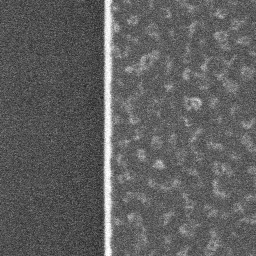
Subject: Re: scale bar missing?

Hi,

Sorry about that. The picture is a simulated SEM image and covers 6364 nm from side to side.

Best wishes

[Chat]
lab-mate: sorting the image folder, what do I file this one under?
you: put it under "one or a few lines or trenches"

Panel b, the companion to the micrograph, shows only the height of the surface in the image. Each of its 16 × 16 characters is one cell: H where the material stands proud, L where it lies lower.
LLLLLLLHHHHHHHHH
LLLLLLLHHHHHHHHH
LLLLLLLHHHHHHHHH
LLLLLLLHHHHHHHHH
LLLLLLLHHHHHHHHH
LLLLLLLHHHHHHHHH
LLLLLLLHHHHHHHHH
LLLLLLLHHHHHHHHH
LLLLLLLHHHHHHHHH
LLLLLLLHHHHHHHHH
LLLLLLLHHHHHHHHH
LLLLLLLHHHHHHHHH
LLLLLLLHHHHHHHHH
LLLLLLLHHHHHHHHH
LLLLLLLHHHHHHHHH
LLLLLLLHHHHHHHHH